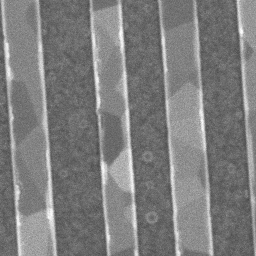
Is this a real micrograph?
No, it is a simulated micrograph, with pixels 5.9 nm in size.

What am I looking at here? one or a few lines or trenches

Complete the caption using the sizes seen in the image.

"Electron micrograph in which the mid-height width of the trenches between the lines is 0.249 microns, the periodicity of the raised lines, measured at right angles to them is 463 nm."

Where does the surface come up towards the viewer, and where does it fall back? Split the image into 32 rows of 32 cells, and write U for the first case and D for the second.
UUUUUDDDDDDUUUUDDDDDUUUUDDDDDDUU
UUUUUDDDDDDUUUUDDDDDUUUUDDDDDDUU
UUUUUDDDDDDUUUUDDDDDUUUUUDDDDDUU
DUUUUDDDDDDUUUUDDDDDUUUUUDDDDDUU
DUUUUDDDDDDDUUUDDDDDUUUUUDDDDDUU
DUUUUDDDDDDDUUUDDDDDUUUUUDDDDDUU
DUUUUDDDDDDDUUUDDDDDUUUUUDDDDDUU
DUUUUDDDDDDDUUUDDDDDUUUUUDDDDDUU
DUUUUDDDDDDDUUUUDDDDDUUUUDDDDDUU
DUUDUDDDDDDDUUUUDDDDDUUUUDDDDDUU
DUDDUDDDDDDDUUUUDDDDDUUUUDDDDDUU
DUUUUUDDDDDDUUUUDDDDDUUUUDDDDDDU
DUUUUUDDDDDDUUUUDDDDDUUUUDDDDDDU
DUUUUUDDDDDDUUUUDDDDDUUUUDDDDDDU
DUUUUUDDDDDDUUUUDDDDDUUUUDDDDDDU
DUUUUUDDDDDDUUUUDDDDDUUUUDDDDDDU
DUUUUUDDDDDDUUUUDDDDDUUUUUDDDDDU
DUUUUUDDDDDDUUUUDDDDDUUUUUDDDDDU
DDUUUUDDDDDDDUUUDDDDDUUUUUDDDDDU
DDUUUUDDDDDDDUUUDDDDDUUUUUDDDDDU
DDUUUUDDDDDDDUUUDDDDDUUUUUDDDDDU
DDUUUUDDDDDDDUUUDDDDDUUUUUDDDDDU
DDUUUUDDDDDDDUUUDDDDDUUUUUDDDDDU
DDUUUUDDDDDDDUUUUDDDDDUUUUDDDDDU
DDUUUUDDDDDDDUUUUDDDDDUUUUDDDDDU
DDUUUDDDDDDDDUUUUDDDDDUUUUDDDDDU
DDUUUDUDDDDDDUUUUDDDDDUUUUDDDDDD
DDUUUUUDDDDDDUUUUDDDDDUUUUDDDDDD
DDUUUUUDDDDDDUUUUDDDDDUUUUDDDDDD
DDUUUUUDDDDDDUUUUDDDDDUUUUDDDDDD
DDUUUUUDDDDDDUUUUDDDDDUUUUDDDDDD
DDUUUUUDDDDDDUUUUDDDDDUUUUDDDDDD